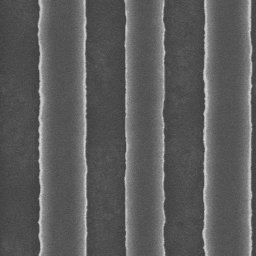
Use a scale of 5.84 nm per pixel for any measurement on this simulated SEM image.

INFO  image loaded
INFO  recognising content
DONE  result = lines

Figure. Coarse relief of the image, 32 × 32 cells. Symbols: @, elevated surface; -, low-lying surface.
-----@@@@@@-----@@@@------@@@@@-
-----@@@@@@-----@@@@------@@@@@-
-----@@@@@@-----@@@@------@@@@@-
-----@@@@@@-----@@@@@-----@@@@@-
-----@@@@@@-----@@@@------@@@@@-
-----@@@@@@-----@@@@------@@@@@-
-----@@@@@@-----@@@@@-----@@@@@-
-----@@@@@@-----@@@@------@@@@@-
-----@@@@@@-----@@@@-----@@@@@@-
-----@@@@@@-----@@@@-----@@@@@@-
-----@@@@@@-----@@@@------@@@@@-
-----@@@@@@-----@@@@------@@@@@-
-----@@@@@@-----@@@@------@@@@@-
-----@@@@@@-----@@@@------@@@@@-
-----@@@@@@-----@@@@------@@@@@-
-----@@@@@@-----@@@@------@@@@@-
-----@@@@@@-----@@@@------@@@@@-
-----@@@@@@-----@@@@-----@@@@@@-
-----@@@@@@-----@@@@------@@@@@-
-----@@@@@@-----@@@@------@@@@@-
-----@@@@@@-----@@@@------@@@@@-
-----@@@@@@-----@@@@------@@@@@-
-----@@@@@@-----@@@@------@@@@@-
-----@@@@@@-----@@@@-----@@@@@@-
-----@@@@@@-----@@@@-----@@@@@@-
-----@@@@@@-----@@@@------@@@@@-
-----@@@@@@-----@@@@------@@@@@-
-----@@@@@@-----@@@@@-----@@@@@-
-----@@@@@@-----@@@@-----@@@@@@-
-----@@@@@@-----@@@@-----@@@@@@-
-----@@@@@@-----@@@@------@@@@@-
-----@@@@@@-----@@@@@-----@@@@@-